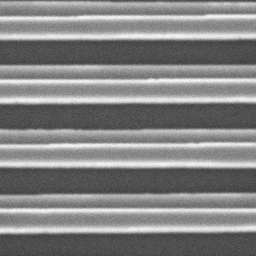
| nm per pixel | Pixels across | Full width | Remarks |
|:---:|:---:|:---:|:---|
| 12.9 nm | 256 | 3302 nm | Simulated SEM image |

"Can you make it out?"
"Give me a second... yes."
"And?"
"lines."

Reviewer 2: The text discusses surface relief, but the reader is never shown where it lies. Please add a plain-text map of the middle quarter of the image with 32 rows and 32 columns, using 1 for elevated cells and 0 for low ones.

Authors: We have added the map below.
00000000000000000000000000000000
11111111111111111111111111111111
11111111111111111111111111111111
11111111111111111111111111111111
11111111111111111111111111111111
11111111111111111111111111111111
11111111111111111111111111111111
11111111111111111111111111111111
11111111111111111111111111111111
00000000000000000000000000000000
00000000000000000000000000000000
00000000000000000000000000000000
00000000000000000000000000000000
00000000000000000000000000000000
00000000000000000000000000000000
00000000000000000000000000000000
00000000000000000000000000000000
11111111111111111111111111111111
11111111111111111111111111111111
11111111111111111111111111111111
11111111111111111111111111111111
11111111111111111111111111111111
11111111111111111111111111111111
11111111111111111111111111111111
11111111111111111111111111111111
00000000000000000000000000000000
00000000000000000000000000000000
00000000000000000000000000000000
00000000000000000000000000000000
00000000000000000000000000000000
00000000000000000000000000000000
00000000000000000000000000000000